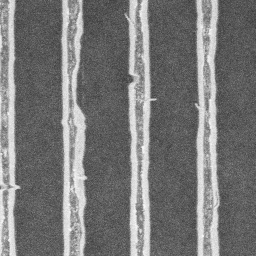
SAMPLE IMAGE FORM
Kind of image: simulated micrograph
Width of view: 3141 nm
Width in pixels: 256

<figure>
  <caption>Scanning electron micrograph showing one or a few lines or trenches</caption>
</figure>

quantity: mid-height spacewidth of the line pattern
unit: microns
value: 0.649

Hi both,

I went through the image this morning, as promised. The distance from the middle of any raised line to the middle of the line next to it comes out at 825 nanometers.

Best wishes